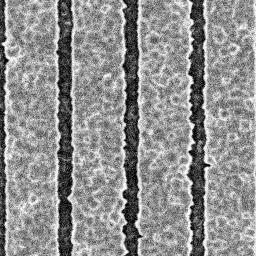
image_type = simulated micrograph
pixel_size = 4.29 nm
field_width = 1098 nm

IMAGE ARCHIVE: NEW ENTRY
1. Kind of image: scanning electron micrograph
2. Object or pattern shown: one or a few lines or trenches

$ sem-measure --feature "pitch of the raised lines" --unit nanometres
285